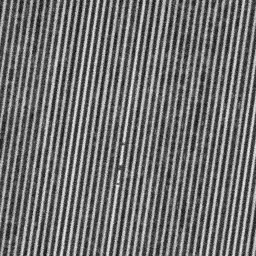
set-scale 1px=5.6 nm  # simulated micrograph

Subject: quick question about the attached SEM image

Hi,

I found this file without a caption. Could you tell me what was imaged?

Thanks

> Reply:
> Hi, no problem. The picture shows parallel lines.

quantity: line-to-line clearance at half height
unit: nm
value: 26.3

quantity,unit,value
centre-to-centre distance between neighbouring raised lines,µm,0.0367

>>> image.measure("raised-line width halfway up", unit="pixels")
1.86